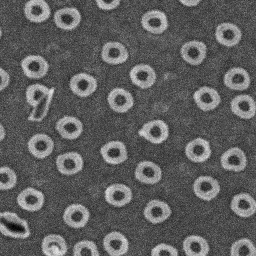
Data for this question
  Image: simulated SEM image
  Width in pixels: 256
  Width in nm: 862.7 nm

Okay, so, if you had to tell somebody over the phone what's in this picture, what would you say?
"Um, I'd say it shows a regular array of ring-shaped raised bodies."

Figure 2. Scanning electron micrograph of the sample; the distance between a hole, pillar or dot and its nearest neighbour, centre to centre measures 126 nm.